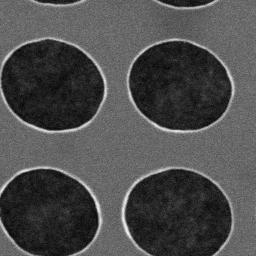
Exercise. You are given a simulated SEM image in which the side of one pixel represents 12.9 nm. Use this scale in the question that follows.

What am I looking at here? holes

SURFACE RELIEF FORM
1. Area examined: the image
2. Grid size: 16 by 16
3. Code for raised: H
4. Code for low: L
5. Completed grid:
HHHHHHHHHHHHHHHH
HHHHHHHHHHHHHHHH
HHHLHHHHHHHHHHHH
HLLLLHHHHLLLLHHH
LLLLLLHHLLLLLLHH
LLLLLLLHLLLLLLHH
HLLLLLHHLLLLLLHH
HLLLLLHHHLLLLLHH
HHHHHHHHHHHHHHHH
HHHHHHHHHHHHHHHH
HHHHHHHHHHHHHHHH
HLLLLHHHHLLLLHHH
LLLLLLHHLLLLLLHH
LLLLLLHHLLLLLLHH
LLLLLLHHLLLLLLHH
HLLLLHHHHLLLLLHH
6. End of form